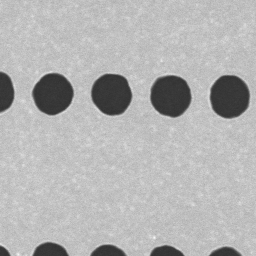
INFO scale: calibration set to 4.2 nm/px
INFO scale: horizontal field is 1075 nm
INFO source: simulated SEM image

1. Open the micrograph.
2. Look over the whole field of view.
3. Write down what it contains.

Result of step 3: holes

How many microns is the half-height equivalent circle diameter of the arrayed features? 0.173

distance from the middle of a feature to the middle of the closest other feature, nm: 247